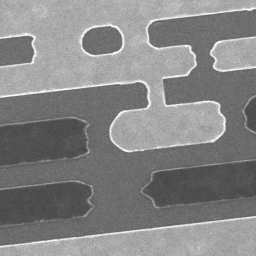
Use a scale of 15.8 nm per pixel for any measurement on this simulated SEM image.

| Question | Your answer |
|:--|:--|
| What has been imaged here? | parallel lines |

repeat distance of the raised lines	986	nanometres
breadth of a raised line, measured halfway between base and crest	591	nm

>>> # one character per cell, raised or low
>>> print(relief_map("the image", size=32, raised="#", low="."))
################################
############################....
####################............
###########...####..............
##..######.....###..............
....######.....####........#####
....#######....#########..######
....####################...#####
########################...####.
######################..........
##############....##............
#####..............#............
...................##..........#
..................#########....#
...............#############...#
..#########...##############...#
###########...##############....
###########...#############.....
###########....#####............
##########......................
###........................#####
...................#############
...................#############
.##########.......##############
###########.......##############
###########........#####........
###########.....................
#######.....................####
....................############
...........#####################
...#############################
################################